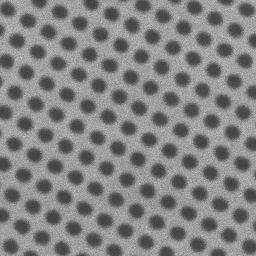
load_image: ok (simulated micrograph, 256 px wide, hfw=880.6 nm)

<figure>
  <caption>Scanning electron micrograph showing a regular array of holes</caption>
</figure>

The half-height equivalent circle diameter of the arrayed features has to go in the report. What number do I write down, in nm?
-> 54.4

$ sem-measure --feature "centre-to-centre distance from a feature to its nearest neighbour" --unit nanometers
78.2